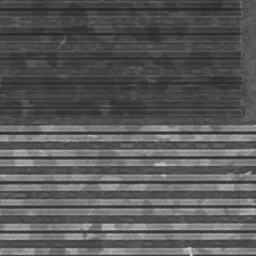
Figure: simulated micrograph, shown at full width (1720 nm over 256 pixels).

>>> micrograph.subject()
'parallel lines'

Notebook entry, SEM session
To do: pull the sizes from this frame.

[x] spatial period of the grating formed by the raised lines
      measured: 82.8 nanometers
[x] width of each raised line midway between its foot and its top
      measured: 0.0395 micrometres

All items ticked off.